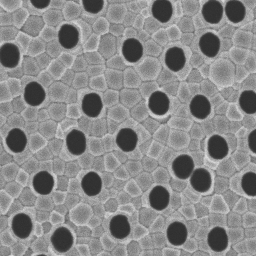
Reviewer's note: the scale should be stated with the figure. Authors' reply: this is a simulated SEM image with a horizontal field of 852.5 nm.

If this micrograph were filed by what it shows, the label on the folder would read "a regular array of holes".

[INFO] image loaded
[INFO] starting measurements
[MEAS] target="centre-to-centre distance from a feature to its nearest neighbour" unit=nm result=139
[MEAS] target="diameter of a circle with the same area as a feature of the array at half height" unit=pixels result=21.2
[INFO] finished